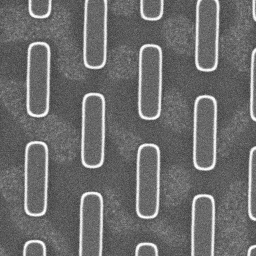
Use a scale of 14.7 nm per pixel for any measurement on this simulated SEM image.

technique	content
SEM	groups of lines, slits or small figures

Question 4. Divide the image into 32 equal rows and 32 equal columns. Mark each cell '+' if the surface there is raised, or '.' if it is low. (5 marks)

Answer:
....++.....++.....++.....++.....
....++.....++.....++.....++.....
...........++............++.....
...........++............++.....
...........++............++.....
....+......++............++.....
....++.....++.....++.....++.....
....++.....++.....++.....++.....
....++............++.....++.....
....++............++............
....++............++............
...+++............++...........+
...+++.....++.....++.....++....+
...+++....+++.....++....+++....+
..........+++.....++....+++.....
..........+++...........+++.....
..........+++...........+++.....
..........+++...........+++.....
...+++....+++.....++....+++.....
...+++....+++....+++....+++....+
...+++.....+.....+++....+++....+
...+++...........+++...........+
...+++...........+++...........+
...+++...........+++...........+
...+++.....+.....+++.....+.....+
...+++....+++....+++....+++....+
...++.....+++....+++....+++....+
..........+++...........+++.....
..........+++...........+++.....
..........+++...........+++.....
...++.....+++.....+.....+++.....
...+++....+++....+++....+++....+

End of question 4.